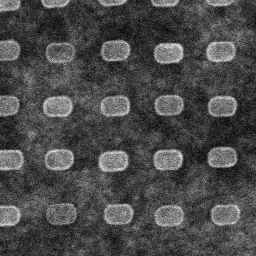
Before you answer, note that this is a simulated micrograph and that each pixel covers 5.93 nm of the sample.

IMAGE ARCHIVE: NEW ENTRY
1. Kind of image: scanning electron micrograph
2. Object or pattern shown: a regular array of raised bodies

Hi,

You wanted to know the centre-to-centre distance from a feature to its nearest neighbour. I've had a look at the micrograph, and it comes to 52.6 pixels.